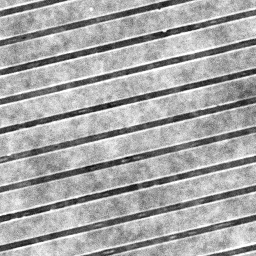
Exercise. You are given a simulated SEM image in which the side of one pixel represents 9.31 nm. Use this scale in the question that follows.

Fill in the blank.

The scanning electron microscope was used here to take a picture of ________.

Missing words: parallel lines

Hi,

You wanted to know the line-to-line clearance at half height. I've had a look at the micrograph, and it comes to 64.6 nanometers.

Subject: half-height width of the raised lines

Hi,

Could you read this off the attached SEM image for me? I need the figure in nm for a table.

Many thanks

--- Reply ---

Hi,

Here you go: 200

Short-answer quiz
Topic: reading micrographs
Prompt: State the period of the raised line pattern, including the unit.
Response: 266 nanometres